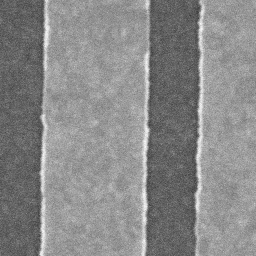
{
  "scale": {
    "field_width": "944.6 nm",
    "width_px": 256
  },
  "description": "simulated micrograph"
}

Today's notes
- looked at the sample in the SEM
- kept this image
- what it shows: one or a few lines or trenches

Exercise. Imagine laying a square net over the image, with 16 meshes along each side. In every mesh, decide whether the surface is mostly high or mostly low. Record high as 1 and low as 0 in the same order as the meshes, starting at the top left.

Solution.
0001111110000111
0001111110001111
0001111110001111
0001111110000111
0001111110000111
0001111110000111
0001111110001111
0001111110001111
0001111110001111
0001111110001111
0001111110001111
0001111110001111
0001111110001111
0001111110001111
0001111110001111
0001111110001111